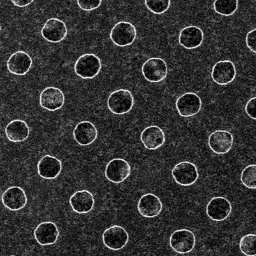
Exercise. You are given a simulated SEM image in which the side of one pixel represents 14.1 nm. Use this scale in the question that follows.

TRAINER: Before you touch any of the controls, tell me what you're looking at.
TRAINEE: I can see a regular array of raised bodies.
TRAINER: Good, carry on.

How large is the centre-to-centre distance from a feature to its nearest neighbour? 47.5 px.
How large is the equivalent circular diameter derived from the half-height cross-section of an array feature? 328 nanometres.